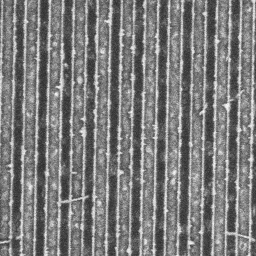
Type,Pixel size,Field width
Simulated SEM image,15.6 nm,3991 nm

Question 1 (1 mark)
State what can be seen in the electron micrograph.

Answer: parallel lines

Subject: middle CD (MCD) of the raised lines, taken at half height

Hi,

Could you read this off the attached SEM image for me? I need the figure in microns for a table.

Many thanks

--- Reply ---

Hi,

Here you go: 0.189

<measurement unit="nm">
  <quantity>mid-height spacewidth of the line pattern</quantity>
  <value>189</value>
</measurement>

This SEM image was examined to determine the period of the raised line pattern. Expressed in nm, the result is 373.